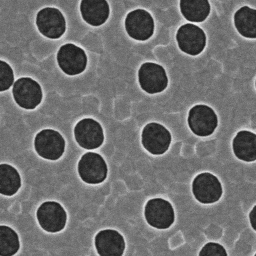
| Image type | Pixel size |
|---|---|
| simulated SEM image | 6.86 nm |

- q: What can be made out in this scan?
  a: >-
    a regular array of holes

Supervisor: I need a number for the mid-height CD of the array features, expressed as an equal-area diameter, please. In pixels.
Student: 30.8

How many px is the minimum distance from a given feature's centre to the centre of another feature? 51.6